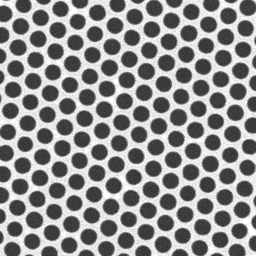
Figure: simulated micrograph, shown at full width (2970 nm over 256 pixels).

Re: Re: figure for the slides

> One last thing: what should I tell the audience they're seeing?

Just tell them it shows a regular array of holes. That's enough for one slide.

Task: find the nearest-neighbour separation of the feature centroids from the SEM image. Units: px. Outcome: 21.1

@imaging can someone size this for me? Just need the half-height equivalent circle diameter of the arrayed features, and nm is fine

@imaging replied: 200